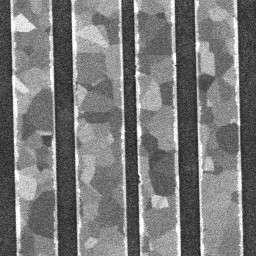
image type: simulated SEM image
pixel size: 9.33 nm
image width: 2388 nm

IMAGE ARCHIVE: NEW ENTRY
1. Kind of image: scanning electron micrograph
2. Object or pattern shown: one or a few lines or trenches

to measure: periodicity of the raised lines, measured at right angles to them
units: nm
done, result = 574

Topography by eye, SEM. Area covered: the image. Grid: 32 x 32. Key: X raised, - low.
-XXXXX---XXXXXX--XXXXX--XXXXXX--
-XXXXX---XXXXXX--XXXXX---XXXXX--
-XXXXX---XXXXXX--XXXXX---XXXXX--
-XXXXX---XXXXXX--XXXXX---XXXXX--
-XXXXX---XXXXXX--XXXXX---XXXXX--
--XXXX---XXXXXX--XXXXX---XXXXX--
--XXXXX--XXXXXX--XXXXX---XXXXX--
--XXXXX--XXXXXX--XXXXX---XXXXX--
--XXXXX--XXXXXX--XXXXX---XXXXX--
--XXXXX--XXXXXX--XXXXX---XXXXX--
--XXXXX--XXXXXX--XXXXX---XXXXX--
--XXXXX--XXXXXX--XXXXX---XXXXX--
--XXXXX--XXXXXX--XXXXX---XXXXX--
--XXXXX--XXXXXX--XXXXX---XXXXX--
--XXXXX--XXXXXX--XXXXX---XXXXX--
--XXXXX--XXXXXX--XXXXX---XXXXX--
--XXXXX--XXXXXXX-XXXXX---XXXXX--
--XXXXX--XXXXXX--XXXXX---XXXXX--
--XXXXX--XXXXXX--XXXXX---XXXXX--
--XXXXX--XXXXXXX-XXXXX---XXXXX--
--XXXXX--XXXXXXX-XXXXX---XXXXX--
--XXXXX---XXXXXX-XXXXX---XXXXX--
--XXXXX---XXXXXX--XXXX---XXXXX--
--XXXXX---XXXXXX-XXXXX---XXXXX--
--XXXXX---XXXXXX--XXXX---XXXXX--
--XXXXX---XXXXXX--XXXX---XXXXX--
--XXXXX---XXXXXX--XXXX---XXXXX--
--XXXXX---XXXXXX--XXXX---XXXXX--
--XXXXX---XXXXXX-XXXXX---XXXXX--
--XXXXX---XXXXXX--XXXX---XXXXX--
--XXXXX---XXXXXX--XXXX---XXXXX--
--XXXXX---XXXXXX--XXXX---XXXXX--